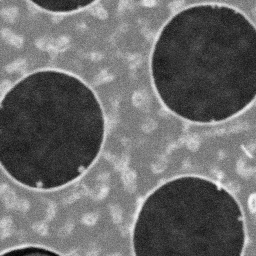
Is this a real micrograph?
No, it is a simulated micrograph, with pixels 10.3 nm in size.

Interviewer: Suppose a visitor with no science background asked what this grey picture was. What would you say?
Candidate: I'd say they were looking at holes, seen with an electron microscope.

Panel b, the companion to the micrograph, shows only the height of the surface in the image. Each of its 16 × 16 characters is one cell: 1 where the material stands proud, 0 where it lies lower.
1110011111110011
1111111111000000
1111111111000000
1111111110000000
1100111110000000
1000001111000000
0000001111000000
0000001111110011
0000001111111111
0000001111111111
0000011111111111
1000111111000111
1111111110000001
1111111110000001
1111111100000001
1001111100000001